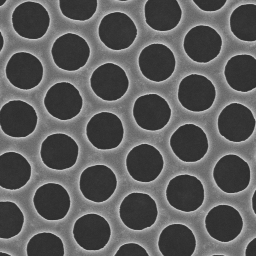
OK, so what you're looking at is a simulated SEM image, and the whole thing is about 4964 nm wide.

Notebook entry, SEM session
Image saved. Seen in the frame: a regular array of holes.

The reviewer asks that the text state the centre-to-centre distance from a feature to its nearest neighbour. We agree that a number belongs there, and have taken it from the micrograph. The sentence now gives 0.953 micrometres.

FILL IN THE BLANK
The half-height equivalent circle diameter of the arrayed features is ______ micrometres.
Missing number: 0.729